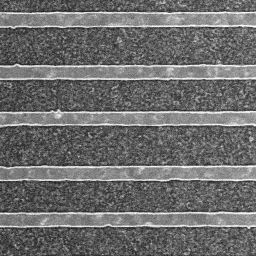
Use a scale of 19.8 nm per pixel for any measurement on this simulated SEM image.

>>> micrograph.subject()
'parallel lines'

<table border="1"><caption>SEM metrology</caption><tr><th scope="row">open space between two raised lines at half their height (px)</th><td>36.6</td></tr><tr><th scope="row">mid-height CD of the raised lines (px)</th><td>13.4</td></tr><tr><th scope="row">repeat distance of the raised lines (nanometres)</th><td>989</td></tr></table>